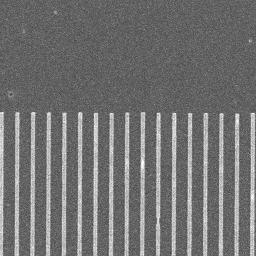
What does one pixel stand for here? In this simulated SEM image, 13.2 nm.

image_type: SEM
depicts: parallel lines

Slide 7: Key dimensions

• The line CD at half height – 3.38 px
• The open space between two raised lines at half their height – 163 nm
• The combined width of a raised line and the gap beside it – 207 nanometres